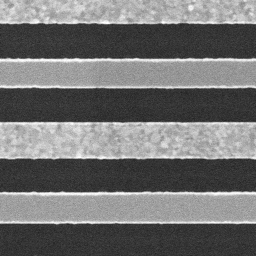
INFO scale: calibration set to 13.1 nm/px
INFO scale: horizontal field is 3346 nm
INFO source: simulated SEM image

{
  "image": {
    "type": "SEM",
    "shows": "lines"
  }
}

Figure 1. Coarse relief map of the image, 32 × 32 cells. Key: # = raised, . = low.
################################
################################
################################
................................
................................
................................
................................
################################
################################
################################
################################
................................
................................
................................
................................
################################
################################
################################
################################
################################
................................
................................
................................
................................
################################
################################
################################
################################
................................
................................
................................
................................